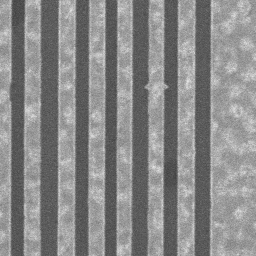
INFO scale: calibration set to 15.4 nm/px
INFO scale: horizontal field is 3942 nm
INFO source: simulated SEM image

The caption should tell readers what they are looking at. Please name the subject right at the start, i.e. parallel lines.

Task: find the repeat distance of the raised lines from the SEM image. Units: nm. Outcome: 474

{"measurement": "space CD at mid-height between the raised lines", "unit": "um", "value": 0.241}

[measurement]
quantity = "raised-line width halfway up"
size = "227 nm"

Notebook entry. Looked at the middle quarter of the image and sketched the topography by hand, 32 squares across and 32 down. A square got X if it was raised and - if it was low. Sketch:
XXX----XXX----XXX----XXXX----XXX
XXX----XXX----XXX----XXXX----XXX
XXX----XXX---XXXX----XXXX----XXX
XXX----XXX---XXXX----XXXX----XXX
XX-----XXX---XXXX----XXXX----XXX
XX-----XXX----XXX----XXXXX---XXX
XX-----XXX----XXX----XXXX----XXX
XX-----XXX----XXX----XXXX----XXX
XXX---XXXX----XXX----XXXX----XXX
XXX---XXXX----XXX----XXXX----XXX
XXX---XXXX----XXX----XXXX----XXX
XXX---XXXX----XXX----XXXX----XXX
XXX---XXXX----XXX----XXXX----XXX
XXX---XXXX----XXX----XXXX----XXX
XXX---XXXX----XXX----XXXX----XXX
XXX---XXXX----XXX----XXXX----XXX
XXX---XXXX---XXXX----XXXX----XXX
XXX---XXXX---XXXX----XXXX----XXX
XXX---XXXX---XXXX----XXXX----XXX
XXX---XXXX---XXXX----XXXX----XXX
XXX---XXXX---XXXX----XXXX----XXX
XXX---XXXX---XXXX----XXXX----XXX
XXX---XXXX---XXXX----XXXX----XXX
XXX---XXXX---XXXX----XXXX----XXX
XXX---XXXX---XXXX----XXXX----XXX
XXX---XXXX---XXXX----XXXX----XXX
XXX---XXXX---XXXX----XXXX----XXX
XXX---XXXX---XXXX----XXXX----XXX
XXX---XXXX---XXXX----XXXX----XXX
XXX---XXXX---XXXX----XXXX----XXX
XXX---XXXX----XXX----XXXX----XXX
XXX---XXXX----XXX----XXXX----XXX